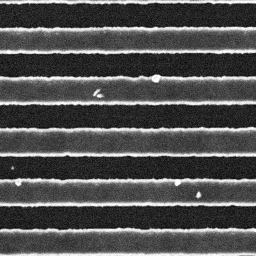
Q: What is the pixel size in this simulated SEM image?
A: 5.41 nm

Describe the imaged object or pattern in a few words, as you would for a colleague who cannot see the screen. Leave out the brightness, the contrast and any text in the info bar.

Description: lines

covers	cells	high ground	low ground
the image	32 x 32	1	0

00000000000000000000000000000000
00000000000000000000000000000000
00000000000000000000000000000000
00000001000101111101111111111111
11111111111111111111111111111111
11111111111111111111111111111111
11111111111111111111111111111111
00000000000000000000000000000000
00000000000000000000000000000000
00000000000000000001000000000000
11111111111111111111111111111111
11111111111111111111111111111111
11111111111111111111111111111111
00000000000000000000000000000000
00000000000000000000000000000000
00000000000000000000000000000000
11111111111111111111111111111111
11111111111111111111111111111111
11111111111111111111111111111111
00000000000000000000000000000000
00000000000000000000000000000000
00000000000000000000000000000000
11111111111111111111111111111111
11111111111111111111111111111111
11111111111111111111111111111111
11111111111111111111111111111111
00000000000000000000000000000000
00000000000000000000000000000000
00000000000000000000000000000000
11111111111111111111111111111111
11111111111111111111111111111111
11111111111111111111111111111111